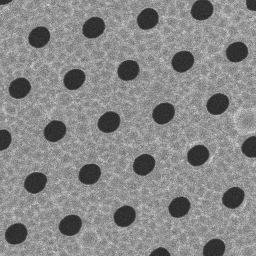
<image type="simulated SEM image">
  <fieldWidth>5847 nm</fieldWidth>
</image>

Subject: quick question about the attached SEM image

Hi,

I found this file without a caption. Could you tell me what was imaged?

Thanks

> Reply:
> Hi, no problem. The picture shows a regular array of holes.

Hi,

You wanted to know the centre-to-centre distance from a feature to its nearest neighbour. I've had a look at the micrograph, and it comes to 1.25 um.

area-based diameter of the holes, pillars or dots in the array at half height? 510 nanometres